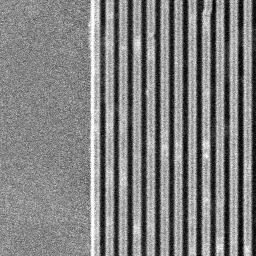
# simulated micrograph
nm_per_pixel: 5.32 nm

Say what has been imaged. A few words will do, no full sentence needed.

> parallel lines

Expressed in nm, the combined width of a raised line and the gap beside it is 73.5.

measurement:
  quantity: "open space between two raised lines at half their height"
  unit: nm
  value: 36.6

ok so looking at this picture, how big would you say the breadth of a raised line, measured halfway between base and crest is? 7.01 pixels